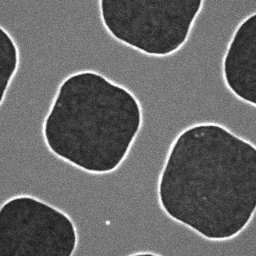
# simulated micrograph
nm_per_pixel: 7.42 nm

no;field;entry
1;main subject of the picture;holes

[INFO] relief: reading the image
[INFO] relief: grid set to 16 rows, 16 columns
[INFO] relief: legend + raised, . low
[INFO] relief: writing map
++++++......++++
+++++++.....+++.
.+++++++...++++.
.+++++++++++++..
.+++++++++++++..
++++...+++++++..
+++......+++++++
+++......+++++++
+++.....+++....+
+++.....+++.....
+++++..+++......
++++++++++......
+.++++++++......
....+++++++.....
.....+++++++...+
.....+++++++++++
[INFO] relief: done